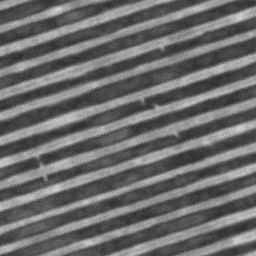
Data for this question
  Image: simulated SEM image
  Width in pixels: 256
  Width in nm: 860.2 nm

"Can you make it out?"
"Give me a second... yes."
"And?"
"parallel lines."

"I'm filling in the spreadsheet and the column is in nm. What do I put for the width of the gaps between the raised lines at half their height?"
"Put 48.4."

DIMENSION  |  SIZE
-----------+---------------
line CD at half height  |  22.4 nm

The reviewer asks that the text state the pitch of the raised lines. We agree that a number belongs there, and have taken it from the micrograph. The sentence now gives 70.9 nanometers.